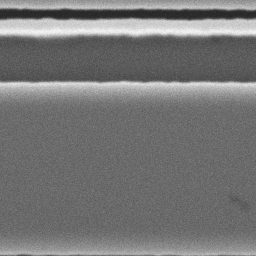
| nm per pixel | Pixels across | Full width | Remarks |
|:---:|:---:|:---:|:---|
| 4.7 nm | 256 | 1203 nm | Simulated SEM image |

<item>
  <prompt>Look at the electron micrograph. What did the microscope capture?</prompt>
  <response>lines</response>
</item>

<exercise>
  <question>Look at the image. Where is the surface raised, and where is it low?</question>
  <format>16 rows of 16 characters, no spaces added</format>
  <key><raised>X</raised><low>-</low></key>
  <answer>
-XXXXXXXXXXXXXXX
XXXXXXXXXXXXXXXX
----------------
----------------
----------------
XXXXXXXXXXXXXXXX
XXXXXXXXXXXXXXXX
XXXXXXXXXXXXXXXX
XXXXXXXXXXXXXXXX
XXXXXXXXXXXXXXXX
XXXXXXXXXXXXXXXX
XXXXXXXXXXXXXXXX
XXXXXXXXXXXXXXXX
XXXXXXXXXXXXXXXX
XXXXXXXXXXXXXXXX
XXXXXXXXXXXXXXXX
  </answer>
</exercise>